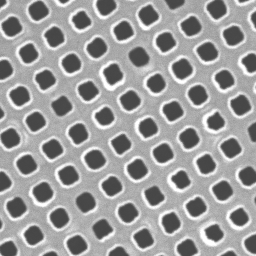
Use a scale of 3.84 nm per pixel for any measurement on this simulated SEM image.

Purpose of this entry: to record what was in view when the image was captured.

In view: a regular array of holes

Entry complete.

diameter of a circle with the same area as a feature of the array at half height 19.1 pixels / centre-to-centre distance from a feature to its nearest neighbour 0.115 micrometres